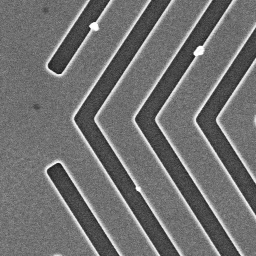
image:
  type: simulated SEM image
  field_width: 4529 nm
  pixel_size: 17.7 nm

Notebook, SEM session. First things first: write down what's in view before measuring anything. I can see groups of lines, slits or small figures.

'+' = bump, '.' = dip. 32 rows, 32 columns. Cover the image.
+++++++++++..++++++..+++++...+++
++++++++++...+++++..++++++..++++
++++++++++..+++++...+++++..+++++
+++++++++..++++++..+++++...+++++
++++++++...+++++...+++++..+++++.
++++++++..+++++...+++++..++++++.
+++++++...+++++..+++++..++++++..
++++++...+++++...+++++..+++++...
++++++..+++++...+++++...+++++..+
+++++++++++++..+++++...+++++..++
++++++++++++...+++++..+++++...++
+++++++++++...+++++...+++++..+++
+++++++++++..+++++...+++++...+++
++++++++++...+++++..+++++...++++
+++++++++...+++++...+++++..+++++
++++++++++..+++++...+++++..+++++
++++++++++...+++++..+++++...++++
+++++++++++..+++++...+++++..++++
+++++++++++...+++++...+++++..+++
++++++++++++...+++++..+++++...++
+++++++.+++++..+++++...+++++..++
++++++..+++++...+++++..+++++...+
++++++...+++++...++++...+++++...
+++++++...+++++..+++++...+++++..
++++++++..+++++...+++++..+++++..
++++++++...+++++...++++...+++++.
+++++++++..++++++..+++++...+++++
++++++++++..+++++...+++++..+++++
++++++++++...+++++..+++++...++++
+++++++++++..+++++...+++++...+++
+++++++++++...+++++...+++++..+++
++++++++++++...+++++..+++++...++